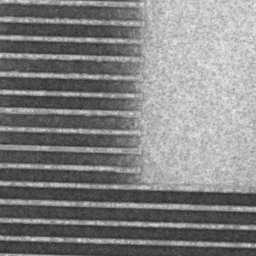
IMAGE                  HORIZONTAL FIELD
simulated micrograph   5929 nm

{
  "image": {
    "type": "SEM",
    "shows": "parallel lines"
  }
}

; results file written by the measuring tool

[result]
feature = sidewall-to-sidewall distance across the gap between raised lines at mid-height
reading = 307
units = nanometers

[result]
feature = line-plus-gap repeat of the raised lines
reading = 422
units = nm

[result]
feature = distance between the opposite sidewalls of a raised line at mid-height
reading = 110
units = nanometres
